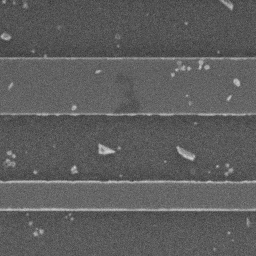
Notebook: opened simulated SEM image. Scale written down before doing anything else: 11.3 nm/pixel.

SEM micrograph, lines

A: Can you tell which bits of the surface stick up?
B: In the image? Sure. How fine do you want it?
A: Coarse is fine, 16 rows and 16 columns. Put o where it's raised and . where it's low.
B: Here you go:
................
................
................
................
oooooooooooooooo
oooooooooooooooo
oooooooooooooooo
................
................
................
................
oooooooooooooooo
oooooooooooooooo
................
................
................